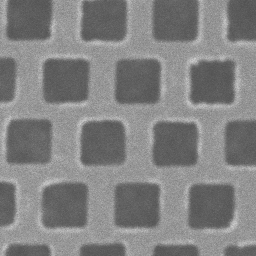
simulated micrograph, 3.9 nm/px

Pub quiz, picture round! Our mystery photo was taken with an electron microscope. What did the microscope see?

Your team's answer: a regular array of holes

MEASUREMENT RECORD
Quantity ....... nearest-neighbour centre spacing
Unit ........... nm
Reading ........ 277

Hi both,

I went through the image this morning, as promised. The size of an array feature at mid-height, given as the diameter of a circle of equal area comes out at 50.2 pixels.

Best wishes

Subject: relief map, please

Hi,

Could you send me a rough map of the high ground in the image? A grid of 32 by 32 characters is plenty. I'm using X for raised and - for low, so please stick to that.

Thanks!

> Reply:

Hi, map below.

X------XXX------XXX------XXX----
X------XXX------XXX------XXX----
X-----XXXX------XXX------XXXX---
X-----XXXX------XXX------XXXX---
X-----XXXX------XXX------XXX----
XXXXXXXXXXXXXXXXXXXXXXXXXXXXXXXX
XXXXXXXXXXXXXXXXXXXXXXXXXXXXXXXX
--XXXX-----XXXX-----XXXXXXXX-XXX
--XXX------XXX------XXXX-----XXX
--XXX------XXX------XXXX-----XXX
--XXX------XXX------XXXX-----XXX
--XXX------XXX------XXXX-----XXX
-XXXXX-----XXX------XXXX-----XXX
XXXXXXXXXXXXXXXXXXXXXXXXXXXXXXXX
XXXXXXXXXXXXXXXXXXXXXXXXXXXXXXXX
X-----XXXX-----XXXX-----XXXX----
X-----XXXX------XXX------XXX----
X------XXX------XXX------XXX----
X-----XXXX------XXX------XXX----
X-----XXXX------XXX------XXX----
X--XXXXXXX-----XXXX-----XXXXX---
XXXXXXXXXXXXXXXXXXXXXXXXXXXXXXXX
XXXXXXXXXXXXXXXXXXXXXXXXXXXXXXXX
--XXX------XXX------XXXX-----XXX
--XXX------XXX------XXXX-----XXX
--XXX------XXX------XXXX-----XXX
--XXX------XXX------XXXX-----XXX
--XXX------XXX------XXXX-----XXX
XXXXXX----XXXXXX--XXXXXX----XXXX
XXXXXXXXXXXXXXXXXXXXXXXXXXXXXXXX
XXXXXXXXXXXXXX-XXXXXXXX-XXXXXXXX
X-----XXXX------XXX------XXX----